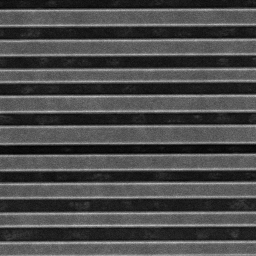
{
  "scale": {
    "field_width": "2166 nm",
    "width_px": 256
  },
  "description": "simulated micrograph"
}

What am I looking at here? parallel lines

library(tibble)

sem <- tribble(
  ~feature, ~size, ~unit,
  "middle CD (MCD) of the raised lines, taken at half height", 136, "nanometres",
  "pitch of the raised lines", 244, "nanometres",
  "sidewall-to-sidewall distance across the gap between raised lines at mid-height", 114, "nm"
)